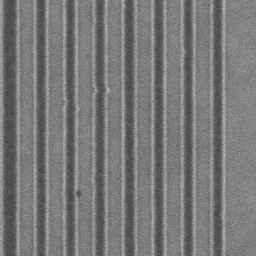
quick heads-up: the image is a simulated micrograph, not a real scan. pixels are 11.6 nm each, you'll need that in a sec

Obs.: parallel lines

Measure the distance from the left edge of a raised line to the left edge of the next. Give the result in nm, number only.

343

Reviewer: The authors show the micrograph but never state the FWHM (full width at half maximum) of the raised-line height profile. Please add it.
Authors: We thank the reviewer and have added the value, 161 nm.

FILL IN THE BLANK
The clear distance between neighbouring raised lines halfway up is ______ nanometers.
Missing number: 183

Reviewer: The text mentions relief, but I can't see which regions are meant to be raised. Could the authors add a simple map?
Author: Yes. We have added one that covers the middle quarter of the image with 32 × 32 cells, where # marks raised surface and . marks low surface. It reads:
###....####....###....#.#....###
###....####....###....###....###
###....####....###....###.....##
###....####....###....###.....##
###....####....###....###.....##
###....####....###....###.....##
###.....###....###....###.....##
###....####....###....###.....##
###....####....###....###.....##
###....####....###....###.....##
###....####....###....###.....##
####...####....###....###.....##
###....####....###....###.....##
###....####....###....###.....##
###....####....###....###.....##
###....####....###....###.....##
###....####....###....###....###
###....####......#....###....###
###....####....#.#....###....###
###....####....#......###.....##
###....####....###....###.....##
###....####....###....###.....##
###....####....###....###.....##
###....####....###....###....###
###....####....###....###....###
###....####....###....###....###
###....####....###....###....###
###....####....###....###.....##
###....####....###....###......#
###....####....###....###......#
###....####....###....###.....##
###....####....###....###....###